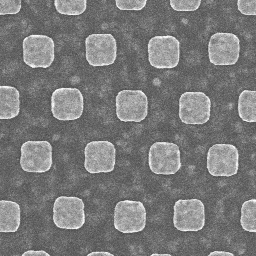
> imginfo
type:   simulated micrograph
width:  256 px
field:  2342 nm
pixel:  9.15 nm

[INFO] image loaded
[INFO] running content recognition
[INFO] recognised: a regular array of raised bodies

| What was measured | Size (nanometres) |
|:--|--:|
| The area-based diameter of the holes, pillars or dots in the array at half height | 304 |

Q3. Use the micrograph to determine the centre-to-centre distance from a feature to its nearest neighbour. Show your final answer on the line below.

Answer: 550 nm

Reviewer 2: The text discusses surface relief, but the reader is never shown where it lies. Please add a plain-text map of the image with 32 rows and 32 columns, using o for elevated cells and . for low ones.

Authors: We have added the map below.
ooo....oooo....ooo...oooo.....oo
oo.....ooo....................oo
................................
................................
...........ooo.............oo...
...oooo....oooo....ooo....oooo..
...oooo....oooo....ooo....oooo..
...oooo....ooo.....ooo....oooo..
................................
................................
................................
oo.....ooo.....ooo.............o
oo.....ooo.....ooo....oooo....oo
oo.....ooo.....ooo....oooo....oo
oo.....ooo.....ooo....oooo....oo
................................
................................
................................
...ooo.....ooo.....ooo....ooo...
...ooo.....ooo.....ooo....oooo..
...ooo.....ooo.....ooo....oooo..
...........oo......ooo....ooo...
................................
................................
................................
oo.....ooo.....ooo....ooo......o
oo.....ooo....oooo....oooo....oo
oo.....ooo....oooo....oooo....oo
oo.............ooo....ooo......o
................................
................................
...oo.......o..............o....